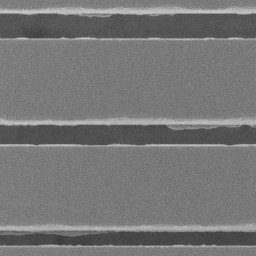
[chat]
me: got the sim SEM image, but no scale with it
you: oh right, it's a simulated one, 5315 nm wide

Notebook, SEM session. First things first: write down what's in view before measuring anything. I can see lines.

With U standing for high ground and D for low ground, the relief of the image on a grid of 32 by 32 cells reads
UUUUUUUUUUUUUUUUUUUUUUUUUUUUUUUU
UUUUUUDDDDUUUUDDUUUDDDDUDUUUDDDD
DDDDDDDDDDDDDDDDDDDDDDDDDDDDDDDD
DDDDDDDDDDDDDDDDDDDDDDDDDDDDDDDD
DDDDDDDDDDDDDDDDDDDDDDDDDDDDDDDD
UUUUUUUUUUUUUUUUUUUUUUUUUUUUUUUU
UUUUUUUUUUUUUUUUUUUUUUUUUUUUUUUU
UUUUUUUUUUUUUUUUUUUUUUUUUUUUUUUU
UUUUUUUUUUUUUUUUUUUUUUUUUUUUUUUU
UUUUUUUUUUUUUUUUUUUUUUUUUUUUUUUU
UUUUUUUUUUUUUUUUUUUUUUUUUUUUUUUU
UUUUUUUUUUUUUUUUUUUUUUUUUUUUUUUU
UUUUUUUUUUUUUUUUUUUUUUUUUUUUUUUU
UUUUUUUUUUUUUUUUUUUUUUUUUUUUUUUU
UUUUUUUUUUUUUUUUUUUUUUUUUUUUUUUU
UUUUUUUUUUUDDDDDDDDDDUUDUDDDDDDD
DDDDDDDDDDDDDDDDDDDDDDDDDDDDDDDD
DDDDDDDDDDDDDDDDDDDDDDDDDDDDDDDD
UUUUUUUUUUUUUUUUUUUUUUUUUUUUUUUU
UUUUUUUUUUUUUUUUUUUUUUUUUUUUUUUU
UUUUUUUUUUUUUUUUUUUUUUUUUUUUUUUU
UUUUUUUUUUUUUUUUUUUUUUUUUUUUUUUU
UUUUUUUUUUUUUUUUUUUUUUUUUUUUUUUU
UUUUUUUUUUUUUUUUUUUUUUUUUUUUUUUU
UUUUUUUUUUUUUUUUUUUUUUUUUUUUUUUU
UUUUUUUUUUUUUUUUUUUUUUUUUUUUUUUU
UUUUUUUUUUUUUUUUUUUUUUUUUUUUUUUU
UUUUUUUUUUUUUUUUUUUUUUUUUUUUUUUU
UUUUUUUUUUUUUUUUUUUUUUUUUUUUUUUU
DDDDDDDDDDDDDDDDDDDDDDDDDDDDDDDD
DDDDDDDDDDDDDDDDDDDDDDDDDDDDDDDD
UUUUUUUUUUUUUUUUUUUUUUUUUUUUUUUU